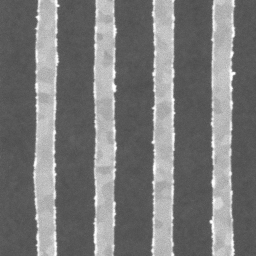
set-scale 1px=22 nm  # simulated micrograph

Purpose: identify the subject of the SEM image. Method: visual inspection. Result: parallel lines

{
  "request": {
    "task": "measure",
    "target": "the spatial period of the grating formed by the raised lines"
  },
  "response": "1290 nanometers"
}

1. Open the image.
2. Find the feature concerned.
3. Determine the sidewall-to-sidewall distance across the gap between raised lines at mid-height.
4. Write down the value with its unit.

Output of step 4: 39.3 pixels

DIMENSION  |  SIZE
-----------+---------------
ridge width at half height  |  0.426 micrometres